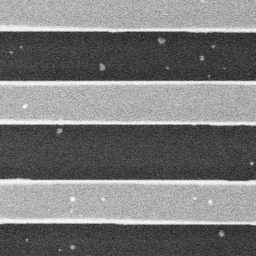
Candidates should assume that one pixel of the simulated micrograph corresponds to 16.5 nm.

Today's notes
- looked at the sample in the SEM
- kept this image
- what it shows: lines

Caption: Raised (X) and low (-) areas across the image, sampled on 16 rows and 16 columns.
XXXXXXXXXXXXXXXX
XXXXXXXXXXXXXXXX
----------------
----------------
----------------
XXXXXXXXXXXXXXXX
XXXXXXXXXXXXXXXX
XXXXXXXXXXXXXXXX
----------------
----------------
----------------
XXXXXXXXXXXXXXXX
XXXXXXXXXXXXXXXX
XXXXXXXXXXXXXXXX
----------------
----------------